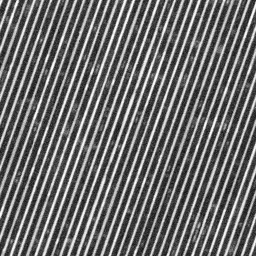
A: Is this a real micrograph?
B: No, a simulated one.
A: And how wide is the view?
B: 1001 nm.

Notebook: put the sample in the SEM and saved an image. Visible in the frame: parallel lines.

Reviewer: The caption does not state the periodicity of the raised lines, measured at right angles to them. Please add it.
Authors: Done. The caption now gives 0.0304 micrometres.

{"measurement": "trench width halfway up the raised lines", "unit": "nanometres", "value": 24.4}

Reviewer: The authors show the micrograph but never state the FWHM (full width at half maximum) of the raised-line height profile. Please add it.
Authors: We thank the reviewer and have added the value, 0.0069 micrometres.